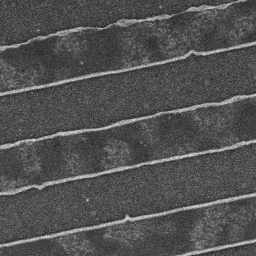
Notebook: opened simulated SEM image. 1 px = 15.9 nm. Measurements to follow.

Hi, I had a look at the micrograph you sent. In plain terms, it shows one or a few lines or trenches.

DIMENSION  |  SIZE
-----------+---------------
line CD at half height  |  726 nm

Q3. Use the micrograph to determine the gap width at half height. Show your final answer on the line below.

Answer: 816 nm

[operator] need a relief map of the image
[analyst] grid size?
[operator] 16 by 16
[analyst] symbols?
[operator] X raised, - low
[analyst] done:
-------------XXX
-------XXXXXXXXX
--XXXXXXXXXXXXXX
XXXXXXXXXXXX----
XXXXXXX---------
XX--------------
-------------XXX
--------XXXXXXXX
---XXXXXXXXXXXXX
XXXXXXXXXXXXX---
XXXXXXXX--------
XXX-------------
--------------XX
---------XXXXXXX
----XXXXXXXXXXXX
XXXXXXXXXXXXXX--